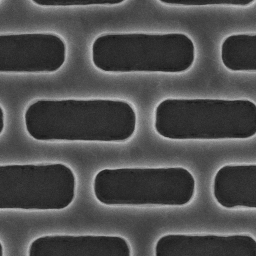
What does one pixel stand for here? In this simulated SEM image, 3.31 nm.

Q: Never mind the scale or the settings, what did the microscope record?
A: holes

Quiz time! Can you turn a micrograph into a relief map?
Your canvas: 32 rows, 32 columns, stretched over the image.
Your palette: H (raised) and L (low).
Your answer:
HHHHHLLLLLLLLLHHHHHHHLLLLLHHLLLH
HHHHHHHHHHHHHHHHHHHHHHHHHHHHHHHH
HHHHHHHHHHHHHHHHHHHHHHHHHHHHHHHH
HHHHHHHHHHHHHHHHHHHHHHHHHHHHHHHH
LLLLLLLHHHHHLLLLLLLLLLLHHHHHHLLL
LLLLLLLLHHHHLLLLLLLLLLLLHHHHLLLL
LLLLLLLLHHHHLLLLLLLLLLLLHHHHLLLL
LLLLLLLLHHHHLLLLLLLLLLLLHHHHLLLL
LLLLLLLHHHHHLLLLLLLLLLLLHHHHLLLL
HHHHHHHHHHHHHHHHHHHHHHHHHHHHHHHH
HHHHHHHHHHHHHHHHHHHHHHHHHHHHHHHH
HHHHHHHHHHHHHHHHHHHHHHHHHHHHHHHH
HHHHHLLLLLLLLHHHHHHHHLLLLLLLLLLH
HHHHLLLLLLLLLLLLLHHHLLLLLLLLLLLL
HHHLLLLLLLLLLLLLLHHLLLLLLLLLLLLL
HHHLLLLLLLLLLLLLLHHLLLLLLLLLLLLL
HHHHLLLLLLLLLLLLLHHHLLLLLLLLLLLL
HHHHHLLHLLLLLLLLHHHHHHHHHHHHHHHH
HHHHHHHHHHHHHHHHHHHHHHHHHHHHHHHH
HHHHHHHHHHHHHHHHHHHHHHHHHHHHHHHH
HHHHLLLHHHHHHHHHHHHHHHHHHHHHHHHL
LLLLLLLLLHHHHLLLLLLLLLLLHHHLLLLL
LLLLLLLLLHHHLLLLLLLLLLLLHHHLLLLL
LLLLLLLLLHHHLLLLLLLLLLLLHHHLLLLL
LLLLLLLLLHHHLLLLLLLLLLLLHHHLLLLL
LLLLLLLLLHHHHLLLLLLLLLLHHHHHLLLL
HHHHHHHHHHHHHHHHHHHHHHHHHHHHHHHH
HHHHHHHHHHHHHHHHHHHHHHHHHHHHHHHH
HHHHHHHHHHHHHHHHHHHHHHHHHHHHHHHH
HHHHHHLLLHLLLHHHHHHHHLLLLLLLLLLH
HHHHLLLLLLLLLLLLHHHHLLLLLLLLLLLL
HHHHLLLLLLLLLLLLHHHLLLLLLLLLLLLL